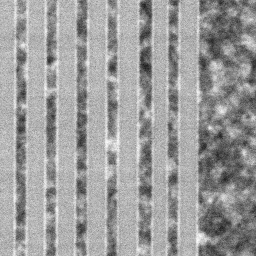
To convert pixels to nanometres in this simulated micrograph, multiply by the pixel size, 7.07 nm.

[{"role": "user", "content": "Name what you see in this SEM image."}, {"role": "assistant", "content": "parallel lines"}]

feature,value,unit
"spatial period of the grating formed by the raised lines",216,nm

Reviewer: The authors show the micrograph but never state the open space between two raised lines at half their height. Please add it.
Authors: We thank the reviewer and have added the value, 125 nm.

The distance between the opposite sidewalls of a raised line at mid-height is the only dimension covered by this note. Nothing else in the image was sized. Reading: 0.0893 µm